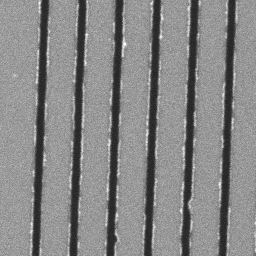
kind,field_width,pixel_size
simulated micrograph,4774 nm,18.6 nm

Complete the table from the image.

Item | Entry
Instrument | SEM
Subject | parallel lines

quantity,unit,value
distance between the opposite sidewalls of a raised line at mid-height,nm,205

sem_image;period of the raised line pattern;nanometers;697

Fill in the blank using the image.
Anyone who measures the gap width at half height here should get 492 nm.